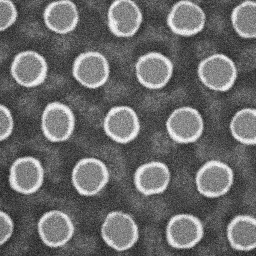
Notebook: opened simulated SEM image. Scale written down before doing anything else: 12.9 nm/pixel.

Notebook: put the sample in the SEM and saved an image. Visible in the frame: a regular array of raised bodies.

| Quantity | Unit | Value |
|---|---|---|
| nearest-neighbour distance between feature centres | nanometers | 789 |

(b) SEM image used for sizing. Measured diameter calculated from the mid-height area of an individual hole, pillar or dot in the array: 435 nanometres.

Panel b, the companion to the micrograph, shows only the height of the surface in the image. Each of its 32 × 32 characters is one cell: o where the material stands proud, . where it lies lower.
o......oo.....ooo.....oo......oo
oo....oooo....ooo.....ooo....ooo
oo....oooo....ooo....oooo....ooo
o.....ooo.....ooo....oooo....ooo
...............................o
................................
................................
..ooo.....ooo.....ooo.....ooo...
..oooo...oooo....oooo....oooo...
..ooo....oooo....oooo....oooo...
...oo.....ooo.....oo......ooo...
................................
................................
......oo.......o................
o....oooo....oooo....oooo....ooo
o....oooo....oooo....oooo....ooo
o.....ooo....oooo....oooo....ooo
.......o.......o......oo......oo
................................
................................
..ooo.....ooo.............o.....
.oooo....oooo....oooo....oooo...
.oooo....oooo....oooo....oooo...
..ooo.....ooo.....ooo....oooo...
..........................o.....
................................
......o.........................
o....oooo....oooo....ooo.....oo.
o....oooo....oooo....oooo....ooo
o....oooo....oooo....oooo....ooo
......oo......oo......oo.....ooo
................................